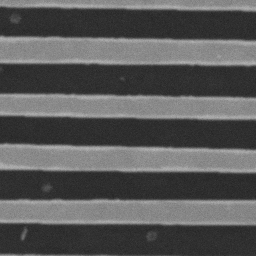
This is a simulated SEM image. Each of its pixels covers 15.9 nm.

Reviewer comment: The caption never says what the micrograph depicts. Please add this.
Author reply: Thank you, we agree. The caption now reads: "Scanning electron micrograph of lines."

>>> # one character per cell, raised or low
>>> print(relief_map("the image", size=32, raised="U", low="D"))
UUUUUUUUUUUUUUUUUUUUUUUUUUUUUUUU
DDDDDDDDDDDDDDDDDDDDDDDDDDDDDDDD
DDDDDDDDDDDDDDDDDDDDDDDDDDDDDDDD
DDDDDDDDDDDDDDDDDDDDDDDDDDDDDDDD
DDDDDDDDDDDDDDDDDDDDDDDDDDDDDDDD
UUUUUUUUUUUUUUUUUUUUUUUUUUUUUUUU
UUUUUUUUUUUUUUUUUUUUUUUUUUUUUUUU
UUUUUUUUUUUUUUUUUUUUUUUUUUUUUUUU
DDDDDDDDDDDDDDDDDDDDDDDDDDDDDDDD
DDDDDDDDDDDDDDDDDDDDDDDDDDDDDDDD
DDDDDDDDDDDDDDDDDDDDDDDDDDDDDDDD
DDDDDDDDDDDDDDDDDDDDDDDDDDDDDDDD
UUUUUUUUUUUUUUUUUUUUUUUUUUUUUUUU
UUUUUUUUUUUUUUUUUUUUUUUUUUUUUUUU
DDDDDUUUUUUUUUUUUUUUUUUUUUUUUUUU
DDDDDDDDDDDDDDDDDDDDDDDDDDDDDDDD
DDDDDDDDDDDDDDDDDDDDDDDDDDDDDDDD
DDDDDDDDDDDDDDDDDDDDDDDDDDDDDDDD
UUUUUUUUUUUUUUUUUUUUUDDDDDDDDDDD
UUUUUUUUUUUUUUUUUUUUUUUUUUUUUUUU
UUUUUUUUUUUUUUUUUUUUUUUUUUUUUUUU
DDDDDDDDDDDDDDDDDDDDDDDDDDDDDUUU
DDDDDDDDDDDDDDDDDDDDDDDDDDDDDDDD
DDDDDDDDDDDDDDDDDDDDDDDDDDDDDDDD
DDDDDDDDDDDDDDDDDDDDDDDDDDDDDDDD
UUUUUUUUUUUUUUUUUUUUUUUUUUUUUUUU
UUUUUUUUUUUUUUUUUUUUUUUUUUUUUUUU
UUUUUUUUUUUUUUUUUUUUUUUUUUUUUUUU
DDDDDDDDDDDDDDDDDDDDDDDDDDDDDDDD
DDDDDDDDDDDDDDDDDDDDDDDDDDDDDDDD
DDDDDDDDDDDDDDDDDDDDDDDDDDDDDDDD
DDDDDDDDDDDDDDDDDDDDDDDDDDDDDDDD